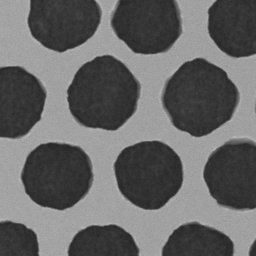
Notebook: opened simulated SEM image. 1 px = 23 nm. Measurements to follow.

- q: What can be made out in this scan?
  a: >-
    holes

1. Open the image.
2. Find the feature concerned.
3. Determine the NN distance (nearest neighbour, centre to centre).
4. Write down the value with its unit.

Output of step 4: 2120 nm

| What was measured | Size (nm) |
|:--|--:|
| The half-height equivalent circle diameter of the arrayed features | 1640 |